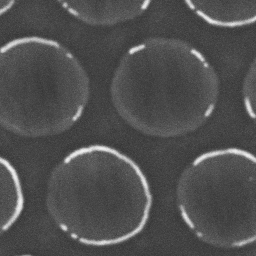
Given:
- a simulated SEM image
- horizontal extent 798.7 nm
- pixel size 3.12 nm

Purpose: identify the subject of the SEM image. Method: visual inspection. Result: raised bodies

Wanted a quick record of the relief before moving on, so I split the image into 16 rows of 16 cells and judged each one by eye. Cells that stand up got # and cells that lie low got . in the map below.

....#####...####
..............#.
.##.............
####....#####...
#####..######...
#####..######..#
#####..######..#
#####...#####...
................
.....##......##.
#...#####...####
#..######..#####
#..######..#####
#..######..#####
....#####...####
................